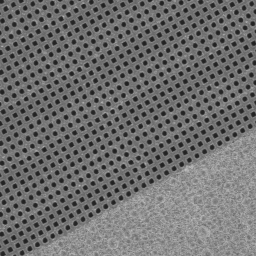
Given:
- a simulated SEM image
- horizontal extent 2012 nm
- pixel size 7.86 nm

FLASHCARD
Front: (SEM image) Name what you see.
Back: a regular array of holes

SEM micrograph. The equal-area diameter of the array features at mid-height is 40.6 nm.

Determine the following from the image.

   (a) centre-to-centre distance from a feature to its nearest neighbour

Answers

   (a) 67.3 nm